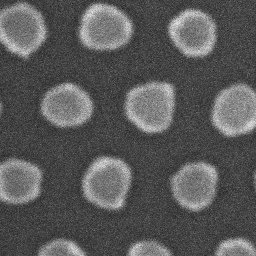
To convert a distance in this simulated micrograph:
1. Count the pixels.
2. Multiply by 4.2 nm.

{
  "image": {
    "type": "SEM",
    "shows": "raised bodies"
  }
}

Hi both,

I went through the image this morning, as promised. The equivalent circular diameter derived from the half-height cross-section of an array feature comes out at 0.189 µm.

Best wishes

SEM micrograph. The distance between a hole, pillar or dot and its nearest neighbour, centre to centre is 359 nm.